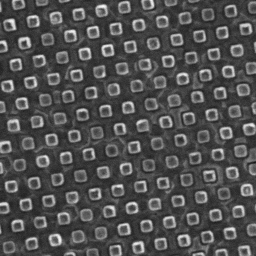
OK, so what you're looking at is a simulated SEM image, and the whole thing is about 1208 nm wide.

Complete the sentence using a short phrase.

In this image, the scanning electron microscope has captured a regular array of raised bodies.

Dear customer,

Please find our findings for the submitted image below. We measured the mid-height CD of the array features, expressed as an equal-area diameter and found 59.5 nm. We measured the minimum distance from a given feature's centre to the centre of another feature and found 0.108 microns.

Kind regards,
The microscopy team